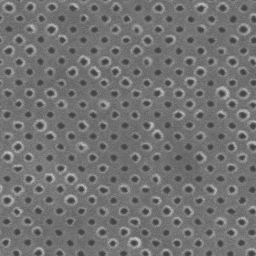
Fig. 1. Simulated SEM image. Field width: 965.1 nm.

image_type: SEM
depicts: a regular array of holes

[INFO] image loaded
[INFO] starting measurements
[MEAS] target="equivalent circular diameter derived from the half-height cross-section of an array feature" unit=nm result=24.8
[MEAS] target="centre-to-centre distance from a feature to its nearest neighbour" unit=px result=14.7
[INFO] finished